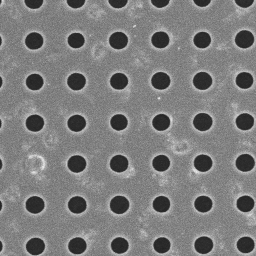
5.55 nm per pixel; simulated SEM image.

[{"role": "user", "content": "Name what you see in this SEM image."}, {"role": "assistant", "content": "a regular array of holes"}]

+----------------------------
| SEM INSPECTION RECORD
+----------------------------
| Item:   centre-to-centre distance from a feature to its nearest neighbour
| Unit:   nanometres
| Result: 227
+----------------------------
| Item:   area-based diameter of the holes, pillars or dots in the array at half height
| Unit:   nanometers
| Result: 97.6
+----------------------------